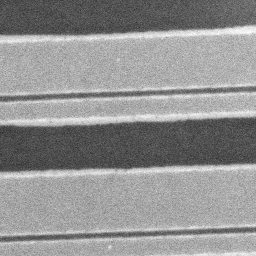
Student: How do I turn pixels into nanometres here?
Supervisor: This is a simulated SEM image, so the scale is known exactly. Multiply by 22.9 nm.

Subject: lines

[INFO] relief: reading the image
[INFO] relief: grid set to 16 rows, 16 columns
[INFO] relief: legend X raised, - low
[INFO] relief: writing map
----------------
----------------
-XXXXXXXXXXXXXXX
XXXXXXXXXXXXXXXX
XXXXXXXXXXXXXXXX
XXXXXXXXXXXXXXXX
XXXXXXXXXXXXXXXX
XXXXX-----------
----------------
----------------
--------------XX
XXXXXXXXXXXXXXXX
XXXXXXXXXXXXXXXX
XXXXXXXXXXXXXXXX
XXXXXXXXXXXXXXXX
XXXXXXXXXXXXXXXX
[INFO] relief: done